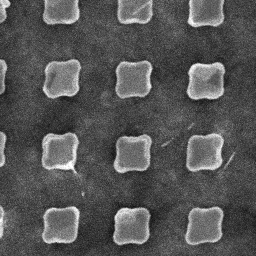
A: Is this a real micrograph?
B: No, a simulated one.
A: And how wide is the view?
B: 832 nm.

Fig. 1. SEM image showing a regular array of raised bodies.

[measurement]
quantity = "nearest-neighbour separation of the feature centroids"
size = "71.5 pixels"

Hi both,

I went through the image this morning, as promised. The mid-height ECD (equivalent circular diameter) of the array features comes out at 38.1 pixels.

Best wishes